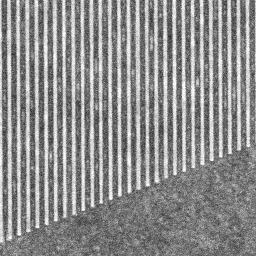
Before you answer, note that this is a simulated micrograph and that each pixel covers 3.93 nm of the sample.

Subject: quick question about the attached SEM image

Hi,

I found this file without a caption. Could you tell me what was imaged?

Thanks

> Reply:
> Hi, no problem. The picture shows parallel lines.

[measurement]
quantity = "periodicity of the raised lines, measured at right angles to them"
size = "36.1 nm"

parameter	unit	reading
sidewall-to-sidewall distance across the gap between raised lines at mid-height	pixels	6.51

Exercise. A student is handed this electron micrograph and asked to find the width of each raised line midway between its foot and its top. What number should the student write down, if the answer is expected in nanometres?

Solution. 10.8